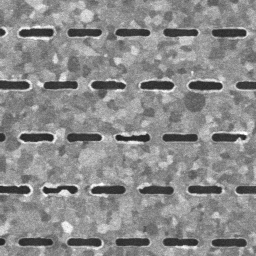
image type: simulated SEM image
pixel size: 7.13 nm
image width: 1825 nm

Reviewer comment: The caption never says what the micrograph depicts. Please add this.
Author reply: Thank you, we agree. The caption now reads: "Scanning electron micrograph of a regular array of holes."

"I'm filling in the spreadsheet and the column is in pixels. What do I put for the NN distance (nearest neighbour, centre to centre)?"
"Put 47.6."